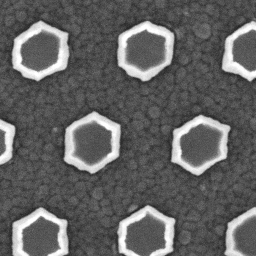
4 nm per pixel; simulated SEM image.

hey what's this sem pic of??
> raised bodies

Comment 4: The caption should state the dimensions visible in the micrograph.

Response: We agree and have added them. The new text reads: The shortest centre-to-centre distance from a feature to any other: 419 nanometres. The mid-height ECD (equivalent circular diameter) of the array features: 206 nm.